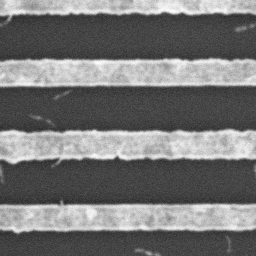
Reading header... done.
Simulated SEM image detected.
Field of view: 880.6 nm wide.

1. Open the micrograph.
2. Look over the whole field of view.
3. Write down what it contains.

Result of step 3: one or a few lines or trenches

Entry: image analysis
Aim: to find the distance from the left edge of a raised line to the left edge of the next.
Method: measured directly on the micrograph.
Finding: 248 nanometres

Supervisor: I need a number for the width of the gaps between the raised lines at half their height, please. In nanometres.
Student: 170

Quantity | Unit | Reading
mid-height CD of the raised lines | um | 0.0796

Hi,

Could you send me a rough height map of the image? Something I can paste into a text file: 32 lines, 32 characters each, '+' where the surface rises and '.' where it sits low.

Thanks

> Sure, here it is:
++++++++++++++++++++++++++++++++
+++++++++.++..+...+....++++.++.+
................................
................................
................................
................................
................................
................................
++++++++++++++++++++++++++++++++
++++++++++++++++++++++++++++++++
++..+++++.++.++++.++++++++.+....
................................
................................
................................
................................
................................
................................
++++++++++++++++++++++++++++++++
++++++++++++++++++++++++++++++++
++++++++++..++++++++++++++++++++
................................
................................
................................
................................
................................
................................
++++++++++++++++++++++++++++++++
++++++++++++++++++++++++++++++++
.++++++++++++++++.++++++++......
................................
................................
................................